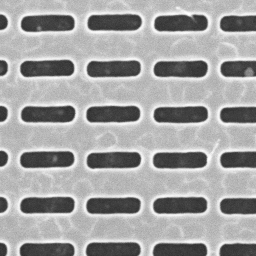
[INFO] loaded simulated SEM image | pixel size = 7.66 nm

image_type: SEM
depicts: a regular array of holes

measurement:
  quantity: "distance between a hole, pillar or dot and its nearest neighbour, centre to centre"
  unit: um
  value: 0.347